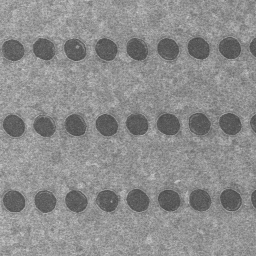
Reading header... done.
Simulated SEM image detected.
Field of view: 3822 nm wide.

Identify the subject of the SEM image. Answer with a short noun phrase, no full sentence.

a regular array of holes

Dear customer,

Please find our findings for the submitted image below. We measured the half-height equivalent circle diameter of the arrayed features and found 338 nm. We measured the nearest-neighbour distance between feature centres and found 0.457 µm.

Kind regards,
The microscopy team